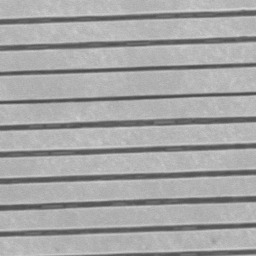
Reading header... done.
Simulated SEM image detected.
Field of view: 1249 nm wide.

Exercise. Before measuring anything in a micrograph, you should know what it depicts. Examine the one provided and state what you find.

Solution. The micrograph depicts parallel lines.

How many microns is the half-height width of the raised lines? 0.0957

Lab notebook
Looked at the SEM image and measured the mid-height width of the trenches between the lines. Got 33.5 nanometres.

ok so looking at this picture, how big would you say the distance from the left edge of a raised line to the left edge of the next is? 130 nm